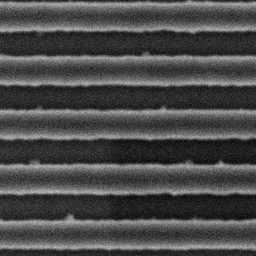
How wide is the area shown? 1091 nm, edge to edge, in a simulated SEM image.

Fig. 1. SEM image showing lines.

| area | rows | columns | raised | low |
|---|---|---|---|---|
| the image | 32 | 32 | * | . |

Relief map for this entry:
********************************
********************************
********************************
********************************
................................
................................
................................
********************************
********************************
********************************
********************************
................................
................................
................................
********************************
********************************
********************************
................................
................................
................................
................................
********************************
********************************
********************************
................................
................................
................................
................................
********************************
********************************
********************************
................................